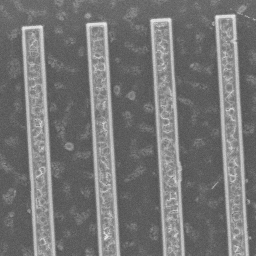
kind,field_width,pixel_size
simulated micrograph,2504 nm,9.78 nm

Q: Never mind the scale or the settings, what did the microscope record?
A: one or a few lines or trenches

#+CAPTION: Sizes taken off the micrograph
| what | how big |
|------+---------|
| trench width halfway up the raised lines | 46.3 pixels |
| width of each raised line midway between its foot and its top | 0.171 um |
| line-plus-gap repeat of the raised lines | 630 nm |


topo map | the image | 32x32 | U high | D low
DDDDDDDDDDDDDDDDDDDDDDDDDDDDDDDD
DDDDDDDDDDDDDDDDDDDDDDDDDDDDDDDD
DDDDDDDDDDDDDDDDDDDDDDDDDDDUUDDD
DDDDUDDDDDDUUDDDDDDUUDDDDDDUUDDD
DDDUUDDDDDDUUDDDDDDUUDDDDDDUUDDD
DDDUUDDDDDDUUDDDDDDUUDDDDDDUUDDD
DDDUUDDDDDDUUDDDDDDUUDDDDDDUUDDD
DDDUUDDDDDDUUDDDDDDUUDDDDDDUUDDD
DDDUUDDDDDDUUDDDDDDUUUDDDDDDUUDD
DDDUUUDDDDDUUDDDDDDUUUDDDDDDUUDD
DDDUUUDDDDDUUUDDDDDUUUDDDDDDUUDD
DDDUUUDDDDDUUUDDDDDUUUDDDDDDUUDD
DDDUUUDDDDDDUUDDDDDDUUDDDDDDUUDD
DDDDUUDDDDDDUUDDDDDDUUDDDDDDUUDD
DDDDUUDDDDDDUUDDDDDDUUDDDDDDUUDD
DDDDUUDDDDDDUUDDDDDDUUDDDDDDUUDD
DDDDUUDDDDDDUUDDDDDDUUDDDDDDUUDD
DDDDUUDDDDDDUUDDDDDDUUDDDDDDUUDD
DDDDUUDDDDDDUUDDDDDDUUDDDDDDUUDD
DDDDUUDDDDDDUUDDDDDDUUDDDDDDUUDD
DDDDUUDDDDDDUUDDDDDDUUDDDDDDUUDD
DDDDUUDDDDDDUUDDDDDDUUDDDDDDUUDD
DDDDUUDDDDDDUUDDDDDDUUDDDDDDUUDD
DDDDUUDDDDDDUUDDDDDDUUDDDDDDUUDD
DDDDUUDDDDDDUUDDDDDDUUUDDDDDUUDD
DDDDUUDDDDDDUUDDDDDDUUUDDDDDUUDD
DDDDUUDDDDDDUUDDDDDDUUUDDDDDDUUD
DDDDUUUDDDDDUUUDDDDDUUUDDDDDDUUD
DDDDUUUDDDDDUUUDDDDDUUUDDDDDDUUD
DDDDUUUDDDDDDUUDDDDDUUUDDDDDDUUD
DDDDUUUDDDDDDUUDDDDDDUUDDDDDDUUD
DDDDDUUDDDDDDUUDDDDDDUUDDDDDDUUD